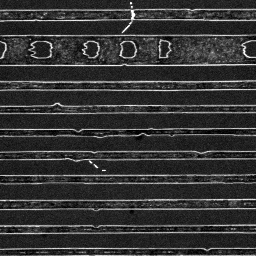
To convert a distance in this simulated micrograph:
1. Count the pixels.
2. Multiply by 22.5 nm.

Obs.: parallel lines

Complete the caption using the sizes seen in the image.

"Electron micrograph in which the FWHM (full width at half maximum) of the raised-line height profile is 366 nm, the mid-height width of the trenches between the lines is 172 nm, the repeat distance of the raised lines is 532 nm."